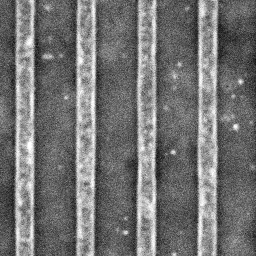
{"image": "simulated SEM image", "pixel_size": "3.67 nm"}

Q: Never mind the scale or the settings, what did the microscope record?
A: wiring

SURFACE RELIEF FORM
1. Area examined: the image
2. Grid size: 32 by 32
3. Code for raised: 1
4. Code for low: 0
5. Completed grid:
00110000001100000110000001100000
00110000001100000110000001100000
00110000001100000110000001100000
00110000001100000110000001100000
00110000001100000110000001100000
00110000001100000110000001100000
00110000001100000110000001100000
00110000001100000110000001100000
00110000001100000110000001100000
00110000001100000110000001100000
00110000001100000110000001100000
00110000001100000110000001100000
00110000001100000110000001100000
00110000001100000110000001100000
00110000001100000110000001100000
00110000001100000110000001100000
00110000001100000110000001100000
00110000001100000110000001100000
00110000001100000110000001100000
00110000001100000110000001100000
00110000001100000110000001100000
00110000001100000110000001100000
00110000001100000110000001100000
00110000001100000110000001100000
00110000001100000110000001100000
00110000001100000110000001100000
00110000001100000110000001100000
00110000001100000110000001100000
00110000001100000110000001100000
00110000001100000110000001100000
00110000001100000110000001100000
00110000001100000110000001100000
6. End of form